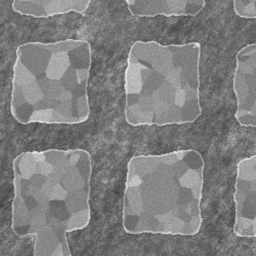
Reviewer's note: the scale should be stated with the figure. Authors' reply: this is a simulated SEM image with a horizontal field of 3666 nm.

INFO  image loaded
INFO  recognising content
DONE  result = raised bodies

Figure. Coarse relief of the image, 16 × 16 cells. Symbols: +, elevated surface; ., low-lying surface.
.++++...+++++..+
................
................
.+++++..++++...+
.+++++..++++...+
.++++...++++...+
.+++++..++++...+
.++++...++++...+
................
...++......+....
.+++++..+++++..+
.+++++..+++++..+
.+++++..++++...+
.+++++..+++++..+
.+++....++++...+
..++............